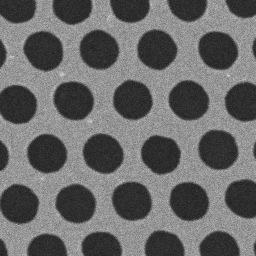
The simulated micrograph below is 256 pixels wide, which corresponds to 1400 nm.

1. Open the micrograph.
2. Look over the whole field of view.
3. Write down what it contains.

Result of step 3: a regular array of holes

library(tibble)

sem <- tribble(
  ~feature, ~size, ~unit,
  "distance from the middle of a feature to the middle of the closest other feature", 305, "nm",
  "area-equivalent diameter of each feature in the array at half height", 216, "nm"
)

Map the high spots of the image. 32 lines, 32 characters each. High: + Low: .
....+++....+++.....++.....++....
....+++....+++.....++.....+++...
+...++++...++++...+++++.++++++++
++++++++++++++++++++++++++++++++
++++...++++...++++...++++....+++
+++.....++.....++.....+++....+++
.++.....++.....++.....+++.....++
.+++....++.....+++....+++....+++
++++...+++++.++++++..++++++.++++
++++++++++++++++++++++++++++++++
++++++++..+++++...++++...+++++..
....+++....+++.....++.....++....
.....++.....++.....++.....++....
.....++.....++.....++.....++....
....++++...++++...++++...++++...
++++++++++++++++++++++++++++++++
++++++++++++++++++++++++++..++++
++++....+++....+++....+++....+++
.+++....++.....+++....+++.....++
.++.....++.....+++.....++.....++
.+++....+++....+++....++++...+++
+++++..+++++..+++++..+++++++++++
++++++++++++++++++++++++++++++.+
+...++++...+++....++++...+++....
.....++.....++.....++.....++....
.....++.....++.....++.....++....
.....++.....+++....+++....+++...
+...++++...+++++.++++++..+++++++
++++++++++++++++++++++++++++++++
+++++..++++...+++++...++++...+++
.+++....++.....+++.....++.....++
.++.....++.....+++.....++.....++